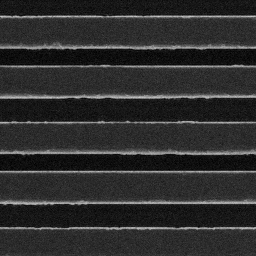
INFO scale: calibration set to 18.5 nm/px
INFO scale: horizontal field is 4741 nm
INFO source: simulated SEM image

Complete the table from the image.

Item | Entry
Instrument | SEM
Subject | lines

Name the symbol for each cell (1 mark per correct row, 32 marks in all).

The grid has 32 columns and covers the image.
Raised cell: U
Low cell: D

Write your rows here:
DDDDDDDDDDDDDDDDDDDDDDDDDDDDDDDD
DDDDDDDDDDDDDDDDDDDDDDDDDDDDDDDD
UUUUUUUUUUUUUUUUUUUUUUUUUUUUUUUU
UUUUUUUUUUUUUUUUUUUUUUUUUUUUUUUU
UUUUUUUUUUUUUUUUUUUUUUUUUUUUUUUU
UUUUUUUUUUUUUUUUUUUUUUUUUUUUUUUU
DDDDDDDDDDDDDDDDDDDDDDDDDDDDDDDD
DDDDDDDDDDDDDDDDDDDDDDDDDDDDDDDD
UUUUUUUUUUUUUUUUUUUUUUUUUUUUUUUU
UUUUUUUUUUUUUUUUUUUUUUUUUUUUUUUU
UUUUUUUUUUUUUUUUUUUUUUUUUUUUUUUU
UUUUUUUUUUUUUUUUUUUUUUUUUUUUUUUU
DDDDDDDDDDDDDDDDDDDDDDDDDDDDDDDD
DDDDDDDDDDDDDDDDDDDDDDDDDDDDDDDD
DDDDDDDDDDDDDDDDDDDDDDDDDDDDDDDD
UUUUUUUUUUUUUUUUUUUUUUUUUUUUUUUU
UUUUUUUUUUUUUUUUUUUUUUUUUUUUUUUU
UUUUUUUUUUUUUUUUUUUUUUUUUUUUUUUU
UUUUUUUUUUUUUUUUUUUUUUUUUUUUUUUU
DDDDDDDDDDDDDDDDDDDDDDDDDDDDDDDD
DDDDDDDDDDDDDDDDDDDDDDDDDDDDDDDD
UUUUUUUUUUUUUUUUUUUUUUUUUUUUUUUU
UUUUUUUUUUUUUUUUUUUUUUUUUUUUUUUU
UUUUUUUUUUUUUUUUUUUUUUUUUUUUUUUU
UUUUUUUUUUUUUUUUUUUUUUUUUUUUUUUU
DDDDDDDDDDDDDDDDDDDDDDDDDDDDDDDD
DDDDDDDDDDDDDDDDDDDDDDDDDDDDDDDD
DDDDDDDDDDDDDDDDDDDDDDDDDDDDDDDD
UUUDDDDDUUUUUDDUUUUUDDDUUDDUUUUU
UUUUUUUUUUUUUUUUUUUUUUUUUUUUUUUU
UUUUUUUUUUUUUUUUUUUUUUUUUUUUUUUU
UUUUUUUUUUUUUUUUUUUUUUUUUUUUUUUU